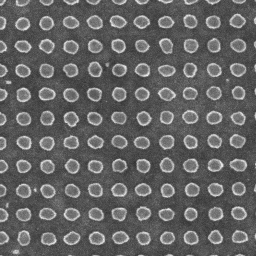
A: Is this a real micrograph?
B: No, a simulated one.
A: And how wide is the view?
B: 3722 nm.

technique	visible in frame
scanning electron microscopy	a regular array of raised bodies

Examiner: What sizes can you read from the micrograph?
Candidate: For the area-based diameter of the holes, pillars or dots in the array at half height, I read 199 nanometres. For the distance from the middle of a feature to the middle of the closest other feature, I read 339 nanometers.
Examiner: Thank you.